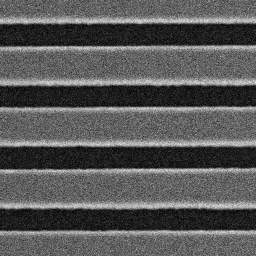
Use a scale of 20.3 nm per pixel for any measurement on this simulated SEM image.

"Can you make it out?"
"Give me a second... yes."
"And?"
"lines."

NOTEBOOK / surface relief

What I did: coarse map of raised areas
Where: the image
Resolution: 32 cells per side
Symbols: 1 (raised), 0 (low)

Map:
11111111111111111111111111111111
11111111111111111111111111111111
11111111111111111111111111111111
00000000000000000000000000000000
00000000000000000000000000000000
00000000000000000000000000000000
11111111111111111111111111111111
11111111111111111111111111111111
11111111111111111111111111111111
11111111111111111111111111111111
11111111111111111111111111111111
00000000000000000000000000000000
00000000000000000000000000000000
10010111100111111111111111111111
11111111111111111111111111111111
11111111111111111111111111111111
11111111111111111111111111111111
11111111111111111111111111111111
00000000000000000000000000000000
00000000000000000000000000000000
00000000000000000000000000000000
11111111111111111111111111111111
11111111111111111111111111111111
11111111111111111111111111111111
11111111111111111111111111111111
11111111111111111111111111111111
00000000000000000000000000000000
00000000000000000000000000000000
00000000000000000000000000000000
11111111111111111111111111111111
11111111111111111111111111111111
11111111111111111111111111111111